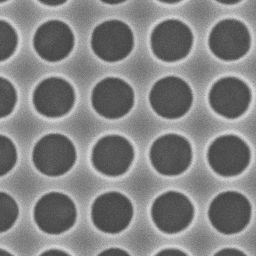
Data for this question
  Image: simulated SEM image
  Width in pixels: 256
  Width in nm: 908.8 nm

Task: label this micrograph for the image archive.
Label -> a regular array of holes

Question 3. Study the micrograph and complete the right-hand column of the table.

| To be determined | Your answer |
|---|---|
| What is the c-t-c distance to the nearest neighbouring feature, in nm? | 203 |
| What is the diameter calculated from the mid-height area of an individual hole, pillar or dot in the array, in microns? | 0.157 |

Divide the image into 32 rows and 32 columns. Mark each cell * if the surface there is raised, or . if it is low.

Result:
*****...*****..******.******..**
********************************
.*****.******..*****...*****..**
..***....***....***.....**.....*
..**.....**......**.....**.....*
..**.....**......**.....**.....*
..**.....***....***.....**.....*
.****...*****..*****...*****..**
********************************
*********************.******.***
..***....***....***.....***....*
..**.....**......**.....**......
..**.....**......**.....**......
..**.....***.....**.....**.....*
.****...*****...****...*****..**
********************************
********************************
.****....***....***.....***...**
..**.....***.....**.....**.....*
..**......*......**.....**.....*
..**.....**......**.....**.....*
.****...****....****...****...**
********************************
********************************
.****....***....****...****....*
..**.....**.....***.....**.....*
..**......*......**.....**.....*
..**......*.....***.....**.....*
.****....***....****...****....*
********************************
********************************
.****...*****...****...****...**